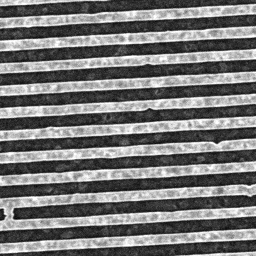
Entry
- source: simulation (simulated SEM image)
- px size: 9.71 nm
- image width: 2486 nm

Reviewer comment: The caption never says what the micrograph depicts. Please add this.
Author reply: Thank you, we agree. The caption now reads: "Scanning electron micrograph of parallel lines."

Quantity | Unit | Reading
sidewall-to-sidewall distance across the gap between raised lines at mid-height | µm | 0.131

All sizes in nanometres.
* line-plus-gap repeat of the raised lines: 218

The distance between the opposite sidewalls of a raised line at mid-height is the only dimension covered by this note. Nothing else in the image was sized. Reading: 0.0873 µm